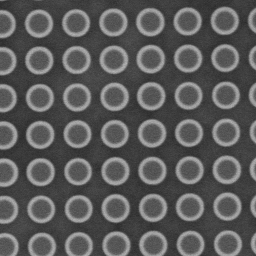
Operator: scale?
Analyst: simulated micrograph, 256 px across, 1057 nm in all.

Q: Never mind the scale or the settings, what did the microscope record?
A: an array of small figures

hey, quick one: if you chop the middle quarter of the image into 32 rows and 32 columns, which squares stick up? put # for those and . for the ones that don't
######...#######...######...####
.#####....#####....#####.....###
................................
................................
................................
.####.....#####....#####.....###
######....######...######...####
######...#######..#######...####
#######..#######..#######...####
#######..#######...######...####
######....#####....#####.....###
..###......###..................
................................
................................
..###......###......####.....###
.#####....#####....######...####
#######..#######...######...####
#######..#######...######...####
#######..#######...######...####
######....#####....######....###
..###......###......###.......##
................................
................................
............##.......##.......##
.#####....#####....######....###
######....######...######...####
#######..#######...######...####
#######..#######...######...####
######....######...######....###
.#####....#####.....####......##
................................
................................